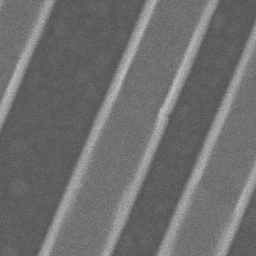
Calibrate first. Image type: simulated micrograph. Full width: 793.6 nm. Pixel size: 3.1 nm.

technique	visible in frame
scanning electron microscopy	one or a few lines or trenches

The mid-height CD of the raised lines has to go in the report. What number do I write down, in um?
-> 0.187